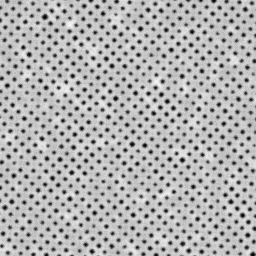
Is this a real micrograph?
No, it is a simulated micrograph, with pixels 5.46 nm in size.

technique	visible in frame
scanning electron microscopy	a regular array of holes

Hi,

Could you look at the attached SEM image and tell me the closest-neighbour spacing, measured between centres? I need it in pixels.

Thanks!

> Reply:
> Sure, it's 8.81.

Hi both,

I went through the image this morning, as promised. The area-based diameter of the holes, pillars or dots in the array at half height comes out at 0.0213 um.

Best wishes